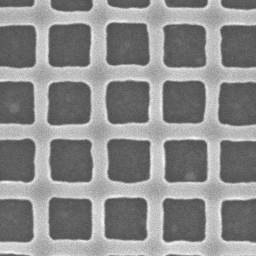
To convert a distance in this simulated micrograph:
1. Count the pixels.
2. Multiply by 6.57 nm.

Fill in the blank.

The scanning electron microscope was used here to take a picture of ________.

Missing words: a regular array of holes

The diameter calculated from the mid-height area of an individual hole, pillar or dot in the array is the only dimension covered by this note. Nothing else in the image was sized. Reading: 48.1 pixels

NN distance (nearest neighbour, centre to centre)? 374 nm